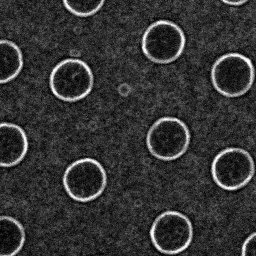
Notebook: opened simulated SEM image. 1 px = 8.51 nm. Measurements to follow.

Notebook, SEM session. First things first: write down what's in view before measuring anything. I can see raised bodies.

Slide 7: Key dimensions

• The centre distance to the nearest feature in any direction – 77 pixels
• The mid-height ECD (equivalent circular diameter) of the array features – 343 nm